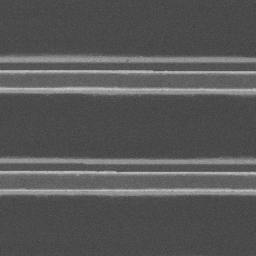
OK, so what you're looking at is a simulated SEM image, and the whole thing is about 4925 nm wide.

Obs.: lines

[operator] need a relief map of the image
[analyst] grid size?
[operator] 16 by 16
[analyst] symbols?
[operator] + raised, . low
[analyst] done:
................
................
................
................
++++++++++++++++
++++++++++++++++
................
................
................
................
++++++++++++++++
++++++++++++++++
................
................
................
................